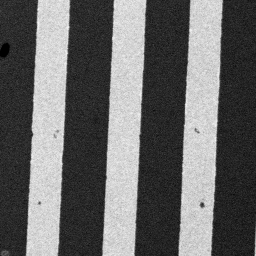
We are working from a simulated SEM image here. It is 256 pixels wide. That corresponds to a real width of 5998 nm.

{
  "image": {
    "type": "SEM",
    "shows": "one or a few lines or trenches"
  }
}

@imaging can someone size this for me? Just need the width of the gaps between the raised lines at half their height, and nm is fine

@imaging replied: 1060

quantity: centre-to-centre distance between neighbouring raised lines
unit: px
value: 76.3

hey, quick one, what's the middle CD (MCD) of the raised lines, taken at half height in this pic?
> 726 nm